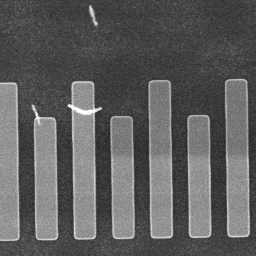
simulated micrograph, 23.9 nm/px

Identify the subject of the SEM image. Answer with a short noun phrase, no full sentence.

groups of lines, slits or small figures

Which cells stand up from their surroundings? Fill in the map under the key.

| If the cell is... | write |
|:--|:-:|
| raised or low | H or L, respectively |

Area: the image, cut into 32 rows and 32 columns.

LLLLLLLLLLLLLLLLLLLLLLLLLLLLLLLL
LLLLLLLLLLLLLLLLLLLLLLLLLLLLLLLL
LLLLLLLLLLLLLLLLLLLLLLLLLLLLLLLL
LLLLLLLLLLLLLLLLLLLLLLLLLLLLLLLL
LLLLLLLLLLLLLLLLLLLLLLLLLLLLLLLL
LLLLLLLLLLLLLLLLLLLLLLLLLLLLLLLL
LLLLLLLLLLLLLLLLLLLLLLLLLLLLLLLL
LLLLLLLLLLLLLLLLLLLLLLLLLLLLLLLL
LLLLLLLLLLLLLLLLLLLLLLLLLLLLLLLL
LLLLLLLLLLLLLLLLLLLLLLLLLLLLLLLL
HHLLLLLLLHHHLLLLLLLHHLLLLLLLHHHL
HHLLLLLLLHHHLLLLLLLHHLLLLLLLHHHL
HHLLLLLLLHHHLLLLLLLHHLLLLLLLHHHL
HHLLLLLLLHHHLLLLLLLHHLLLLLLLHHHL
HHLLLLLLLHHHLLLLLLLHHLLLHHLLHHHL
HHLLHHHLLHHHLLHHHLLHHLLHHHLLHHHL
HHLLHHHLLHHHLLHHHLLHHLLHHHLLHHHL
HHLLHHHLLHHHLLHHHLLHHLLHHHLLHHHL
HHLLHHHLLHHHLLHHHLLHHLLHHHLLHHHL
HHLLHHHLLHHHLLHHHLLHHLLLHHLLHHHL
HHLLHHHLLHHHLLHHHLLHHLLLHHLLHHHL
HHLLHHHLLHHHLLHHHLLHHLLLHHLLHHHL
HHLLHHHLLHHHLLHHHLLHHHLLHHLLHHHL
HHLLHHHLLHHHLLHHHLLHHHLLHHLLHHHL
HHLLHHHLLHHHLLHHHLLHHHLLHHLLHHHL
HHLLHHHLLHHHLLHHHLLHHHLLHHLLHHHL
HHLLHHHLLHHHLLHHHLLHHHLLHHLLHHHL
HHLLHHHLLHHHLLHHHLLHHHLLHHLLHHHL
HHLLLHHLLHHHLLHHHLLHHHLLHHLLHHHL
HHLLLHHLLHHHLLHHHLLHHLLLHHLLLHHL
LLLLLLLLLLLLLLLLLLLLLLLLLLLLLLLL
LLLLLLLLLLLLLLLLLLLLLLLLLLLLLLLL